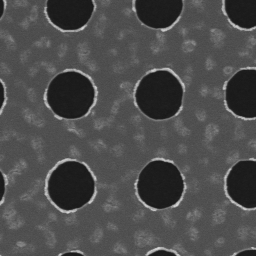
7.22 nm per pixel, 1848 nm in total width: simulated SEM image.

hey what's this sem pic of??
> holes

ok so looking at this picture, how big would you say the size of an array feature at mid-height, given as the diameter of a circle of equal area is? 0.342 microns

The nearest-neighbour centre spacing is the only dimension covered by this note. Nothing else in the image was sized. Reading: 644 nanometers